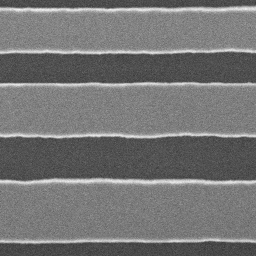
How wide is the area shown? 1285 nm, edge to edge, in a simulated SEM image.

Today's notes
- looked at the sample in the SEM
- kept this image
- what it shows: lines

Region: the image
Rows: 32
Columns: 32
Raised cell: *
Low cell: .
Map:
................................
********************************
********************************
********************************
********************************
********************************
**.....****************.........
................................
................................
................................
**************.*****************
********************************
********************************
********************************
********************************
********************************
********************************
................................
................................
................................
................................
................................
................................
********************************
********************************
********************************
********************************
********************************
********************************
********************************
................................
................................